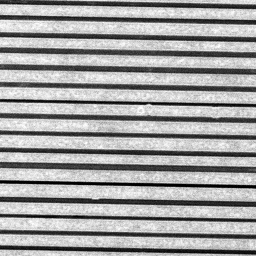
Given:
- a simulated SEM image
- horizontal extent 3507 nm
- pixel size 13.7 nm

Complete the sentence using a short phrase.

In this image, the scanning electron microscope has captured parallel lines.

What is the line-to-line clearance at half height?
71.9 nm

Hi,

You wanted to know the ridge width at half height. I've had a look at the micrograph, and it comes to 0.158 um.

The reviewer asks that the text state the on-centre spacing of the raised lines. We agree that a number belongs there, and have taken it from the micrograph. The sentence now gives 225 nm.